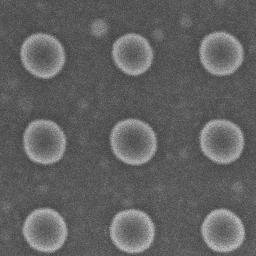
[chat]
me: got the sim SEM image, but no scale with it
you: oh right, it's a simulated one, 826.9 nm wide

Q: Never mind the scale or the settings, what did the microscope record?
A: a regular array of raised bodies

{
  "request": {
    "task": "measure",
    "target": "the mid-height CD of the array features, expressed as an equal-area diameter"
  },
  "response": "138 nm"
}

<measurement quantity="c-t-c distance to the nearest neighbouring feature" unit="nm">283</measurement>